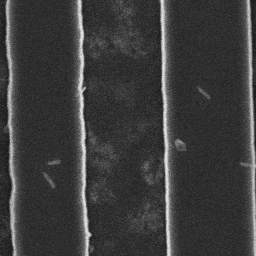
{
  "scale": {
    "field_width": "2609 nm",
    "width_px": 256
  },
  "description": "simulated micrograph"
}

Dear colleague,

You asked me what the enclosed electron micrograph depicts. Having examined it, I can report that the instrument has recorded one or a few lines or trenches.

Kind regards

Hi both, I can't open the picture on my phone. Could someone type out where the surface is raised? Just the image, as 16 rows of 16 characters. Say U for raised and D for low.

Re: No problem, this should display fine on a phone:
UUUUUDDDDDUUUUUU
UUUUUDDDDDUUUUUU
UUUUUDDDDDUUUUUU
DUUUUDDDDDUUUUUU
DUUUUDDDDDUUUUUU
DUUUUDDDDDUUUUUU
DUUUUDDDDDUUUUUU
DUUUUDDDDDUUUUUU
DUUUUDDDDDUUUUUU
DUUUUDDDDDUUUUUU
DUUUUDDDDDUUUUUU
DUUUUDDDDDUUUUUU
DUUUUDDDDDUUUUUU
DUUUUDDDDDUUUUUU
DUUUUUDDDDUUUUUU
DUUUUDDDDDDUUUUU